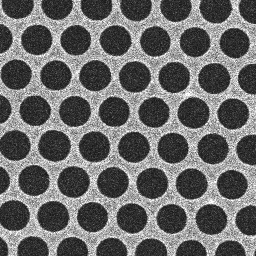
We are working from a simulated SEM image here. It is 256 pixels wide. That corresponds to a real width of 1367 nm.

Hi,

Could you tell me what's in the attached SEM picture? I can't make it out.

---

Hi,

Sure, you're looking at a regular array of holes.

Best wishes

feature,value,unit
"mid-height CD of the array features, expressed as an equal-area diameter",168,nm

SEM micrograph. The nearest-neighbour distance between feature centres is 211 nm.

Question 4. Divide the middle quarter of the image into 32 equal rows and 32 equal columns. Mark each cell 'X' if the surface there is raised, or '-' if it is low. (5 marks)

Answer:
-XXXX------XXXX------XXXX-----XX
--XX-------XXX-------XXX-------X
--XX--------XX--------XX-------X
--XX--------XX--------X---------
--XX--------XX-------XXX-------X
-XXXX------XXX-------XXX-------X
XXXXXX---XXXXXX-----XXXXX-----XX
XXXXXXXXXXXXXXXXXXXXXXXXXXX-XXXX
X----XXXXXX---XXXXXXX---XXXXXXX-
------XXXX------XXXX-----XXXXX--
-------XX-------XXX-------XXX---
-------XX--------X--------XX----
-------XX--------X---------X----
------XXX-------XXX-------XX----
------XXXX------XXX-------XXX---
X---XXXXXXX---XXXXXX-----XXXXX--
XXXXXXXXXXXXXXXXXXXXXXXXXXXXXXXX
XXXXX-----XXXXX-----XXXXXX---XXX
-XXX-------XXX-------XXX------XX
--XX-------XXX-------XXX-------X
--XX--------XX-------XX--------X
--XX--------X---------X--------X
-XXX-------XXX-------XXX-------X
-XXXX-----XXXXX-----XXXX------XX
XXXXXXX--XXXXXXX---XXXXXXX---XXX
X--XXXXXXXXXXXXXXXXXXXXXXXXXXXXX
-----XXXXX-----XXXXX----XXXXXX--
------XXX-------XXX------XXXX---
------XX--------XX--------XX----
-------X--------XX--------XX----
------XX--------XX--------XX----
------XXX-------XX--------XX----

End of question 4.